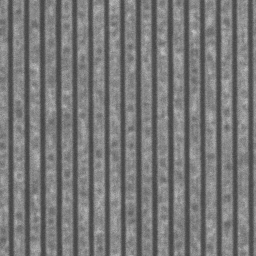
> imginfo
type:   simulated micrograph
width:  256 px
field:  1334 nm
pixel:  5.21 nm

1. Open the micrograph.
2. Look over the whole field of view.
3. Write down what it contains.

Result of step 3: parallel lines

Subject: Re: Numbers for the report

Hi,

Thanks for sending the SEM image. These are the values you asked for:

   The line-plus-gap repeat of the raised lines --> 16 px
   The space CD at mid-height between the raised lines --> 33.9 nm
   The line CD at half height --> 0.0482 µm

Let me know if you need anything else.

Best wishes